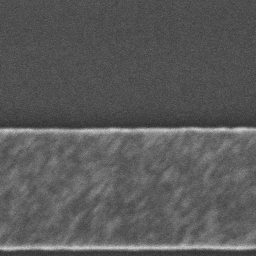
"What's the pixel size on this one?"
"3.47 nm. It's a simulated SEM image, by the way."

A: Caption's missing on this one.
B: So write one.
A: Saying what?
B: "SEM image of one or a few lines or trenches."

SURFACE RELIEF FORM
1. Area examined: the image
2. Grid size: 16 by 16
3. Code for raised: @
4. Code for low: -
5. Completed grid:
----------------
----------------
----------------
----------------
----------------
----------------
----------------
----------------
@@@@@@@@@@@@@@@@
@@@@@@@@@@@@@@@@
@@@@@@@@@@@@@@@@
@@@@@@@@@@@@@@@@
@@@@@@@@@@@@@@@@
@@@@@@@@@@@@@@@@
@@@@@@@@@@@@@@@@
@@---------@--@@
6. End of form